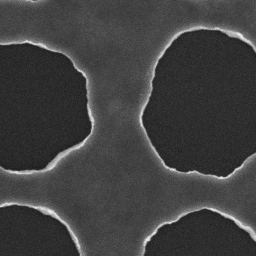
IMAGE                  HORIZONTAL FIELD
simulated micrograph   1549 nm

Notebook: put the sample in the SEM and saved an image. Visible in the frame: holes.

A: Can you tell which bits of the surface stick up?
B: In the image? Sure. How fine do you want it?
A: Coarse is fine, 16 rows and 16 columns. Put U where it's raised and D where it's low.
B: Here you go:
UUUUUUUUUUUUUUUU
UUUUUUUUUUUUUUUU
UUUUUUUUUUUDDDDU
DDDDUUUUUUDDDDDD
DDDDDUUUUUDDDDDD
DDDDDUUUUDDDDDDD
DDDDDUUUUDDDDDDD
DDDDDDUUUDDDDDDD
DDDDDUUUUDDDDDDD
DDDDUUUUUUDDDDDD
DDDUUUUUUUUDDDDU
UUUUUUUUUUUUUUUU
UUUUUUUUUUUUUUUU
DDDUUUUUUUUDDDUU
DDDDUUUUUUDDDDDD
DDDDDUUUUDDDDDDD